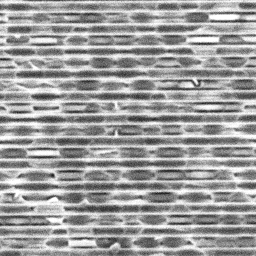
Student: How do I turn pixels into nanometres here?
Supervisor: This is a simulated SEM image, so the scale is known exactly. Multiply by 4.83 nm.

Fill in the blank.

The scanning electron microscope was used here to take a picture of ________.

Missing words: parallel lines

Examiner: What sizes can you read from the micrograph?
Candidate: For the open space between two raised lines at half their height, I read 56.2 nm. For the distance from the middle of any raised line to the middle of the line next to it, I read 109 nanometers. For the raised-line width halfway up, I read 51.9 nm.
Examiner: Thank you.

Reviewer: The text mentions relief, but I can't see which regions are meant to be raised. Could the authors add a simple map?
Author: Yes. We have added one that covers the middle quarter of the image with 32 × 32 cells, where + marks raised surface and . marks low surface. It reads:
................................
++++++++++++++++++++++++++++++++
++++++++++++++++++++++++++++++++
++++++++++++++++++++++++++++++++
................................
................................
................................
++++++++++++++++++++++++++++++++
++++++++++++++++++++++++++++++++
............++..................
................................
................................
........................++++++++
++++++++++++++++++++++++++++++++
++++++++++++++++++++++++++++++++
................................
................................
................................
++++++++++++++++++++++++++++++++
++++++++++++++++++++++++++++++++
+++++++++++++++++++++++......++.
................................
................................
................................
++++++++++++++++++++++++++++++++
++++++++++++++++++++++++++++++++
................................
................................
................................
++++++++++++++++++++++++++++++++
++++++++++++++++++++++++++++++++
++++++++++++++++++++++++++++++++